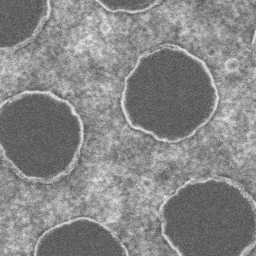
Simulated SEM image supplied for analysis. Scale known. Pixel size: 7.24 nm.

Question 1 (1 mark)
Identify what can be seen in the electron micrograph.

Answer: raised bodies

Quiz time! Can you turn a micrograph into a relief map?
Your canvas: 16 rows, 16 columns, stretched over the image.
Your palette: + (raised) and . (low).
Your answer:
+++....++.......
+++.............
++..............
.........+++....
........+++++...
........+++++...
++++....++++++..
+++++...+++++...
+++++.....++....
+++++...........
.++++...........
............+++.
..........++++++
..........++++++
...++++...++++++
..++++++...+++++